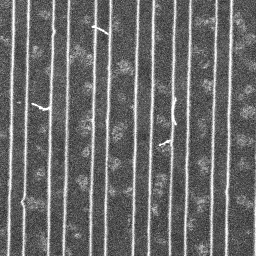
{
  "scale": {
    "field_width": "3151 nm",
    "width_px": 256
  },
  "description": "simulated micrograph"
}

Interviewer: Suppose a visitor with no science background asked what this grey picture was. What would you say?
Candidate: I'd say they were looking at parallel lines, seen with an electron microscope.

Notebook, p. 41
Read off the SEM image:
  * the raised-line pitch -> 499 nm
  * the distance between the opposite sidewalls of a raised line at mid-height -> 188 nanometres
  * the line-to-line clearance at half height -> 0.315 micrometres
